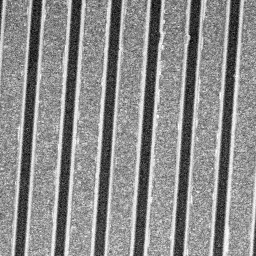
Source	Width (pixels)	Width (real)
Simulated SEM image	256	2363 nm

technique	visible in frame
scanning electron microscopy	parallel lines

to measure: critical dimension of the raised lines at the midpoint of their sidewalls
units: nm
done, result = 251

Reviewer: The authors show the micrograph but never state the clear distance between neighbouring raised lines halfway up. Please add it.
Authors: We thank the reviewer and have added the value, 113 nm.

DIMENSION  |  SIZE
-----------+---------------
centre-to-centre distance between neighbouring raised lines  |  365 nm